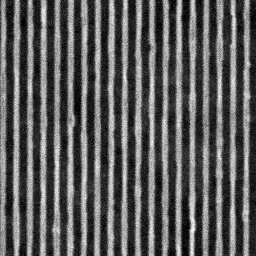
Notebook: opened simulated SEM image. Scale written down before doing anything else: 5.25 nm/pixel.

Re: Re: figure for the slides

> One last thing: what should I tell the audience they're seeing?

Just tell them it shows parallel lines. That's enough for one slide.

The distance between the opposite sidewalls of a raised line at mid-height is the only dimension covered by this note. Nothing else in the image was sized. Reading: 19.7 nm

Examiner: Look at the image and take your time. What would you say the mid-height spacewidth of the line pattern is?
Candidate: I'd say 49.2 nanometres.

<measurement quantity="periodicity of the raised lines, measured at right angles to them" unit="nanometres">70.9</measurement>